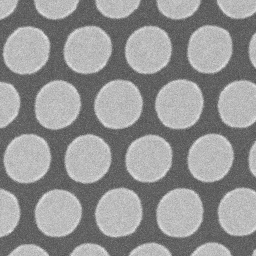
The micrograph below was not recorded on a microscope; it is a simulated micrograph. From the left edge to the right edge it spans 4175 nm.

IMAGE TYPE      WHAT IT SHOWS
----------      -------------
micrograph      a regular array of raised bodies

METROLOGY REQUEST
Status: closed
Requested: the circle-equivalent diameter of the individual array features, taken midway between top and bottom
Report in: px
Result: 46.3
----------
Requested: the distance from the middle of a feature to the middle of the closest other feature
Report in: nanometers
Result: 994